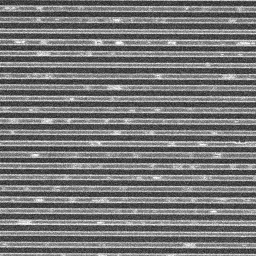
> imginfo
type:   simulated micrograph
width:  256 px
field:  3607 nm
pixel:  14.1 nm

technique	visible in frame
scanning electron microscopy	parallel lines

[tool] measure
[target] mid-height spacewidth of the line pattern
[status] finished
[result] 0.0863 micrometres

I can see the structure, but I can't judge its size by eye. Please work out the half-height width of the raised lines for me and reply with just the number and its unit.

74 nm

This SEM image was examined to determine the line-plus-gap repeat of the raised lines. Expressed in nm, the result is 159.